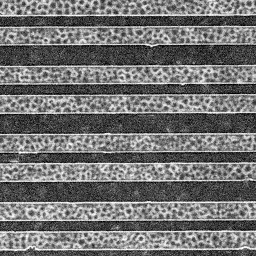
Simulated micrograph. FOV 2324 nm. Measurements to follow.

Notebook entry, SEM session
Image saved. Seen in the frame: parallel lines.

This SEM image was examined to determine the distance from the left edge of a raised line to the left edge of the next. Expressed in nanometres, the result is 310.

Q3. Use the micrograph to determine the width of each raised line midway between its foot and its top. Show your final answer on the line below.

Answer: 162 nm